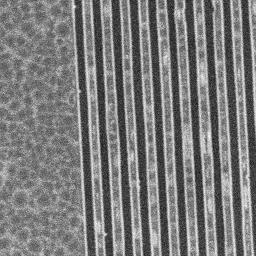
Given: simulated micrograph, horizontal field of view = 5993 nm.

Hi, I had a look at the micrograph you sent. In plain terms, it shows parallel lines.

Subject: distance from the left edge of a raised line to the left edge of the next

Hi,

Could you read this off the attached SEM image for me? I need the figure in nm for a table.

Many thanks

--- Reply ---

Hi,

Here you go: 433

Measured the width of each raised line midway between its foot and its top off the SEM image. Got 202 nanometres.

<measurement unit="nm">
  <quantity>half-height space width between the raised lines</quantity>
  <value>222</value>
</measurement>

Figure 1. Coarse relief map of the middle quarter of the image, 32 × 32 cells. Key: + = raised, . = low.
+++...++..++...++..+++..++...++.
+++...++..++...++...++..++...++.
+++...++..++...++...++..++...++.
+++...++..+++..++...++..+++..++.
+++...++..+++..++...++...++..++.
+++...++..+++..++...++...+...++.
++++..++...++..++...++...++..++.
++++..++...++..++...++...++..++.
++++..++...++..++...++...++..++.
++++..++...++..++...++...++..++.
++++..++...++..++...++...++..++.
++++...+...++...+...++...++..++.
++++..++...++...++..++...++..+++
++++..++...++...++..++...++..+++
++++..++...++...++..++...++...++
++++..++...++...++..++...++...++
++++...+...++...++...+...++...++
++++...++..+++..++...++..++...++
++++...++..+++..++...++..++...++
++++...++..+++..++...++..++...++
++++...++..+++..++...++..++...++
++++...++..+++..++...++..++...++
++++...++..+++..++...++..++...++
++++...++..+++..++...++..++...++
++++...++..+++..++...++..++...++
++++...++...++..++...++...+...++
++++...++...++..++...++...++..++
+++++..++...++..++...++...++..++
+++++..++...++..++...++...++..++
+++++..++...++..+++..++...++..++
+++++..++...++...++..++...++..++
+++++..++...++...++..++...++..++